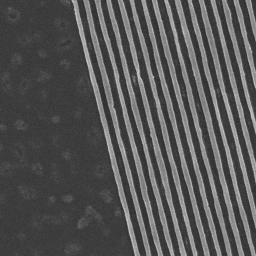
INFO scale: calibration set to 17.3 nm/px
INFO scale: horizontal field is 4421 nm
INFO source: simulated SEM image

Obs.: parallel lines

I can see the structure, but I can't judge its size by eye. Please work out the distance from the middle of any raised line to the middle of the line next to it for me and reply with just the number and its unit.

194 nanometers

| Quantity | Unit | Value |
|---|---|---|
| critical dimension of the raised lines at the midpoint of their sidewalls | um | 0.0691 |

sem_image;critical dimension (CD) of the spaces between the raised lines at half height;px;6.91